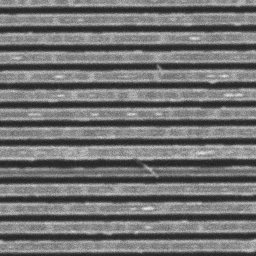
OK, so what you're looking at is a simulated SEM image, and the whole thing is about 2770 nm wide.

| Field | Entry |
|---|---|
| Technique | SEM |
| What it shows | parallel lines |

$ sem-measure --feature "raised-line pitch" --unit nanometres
204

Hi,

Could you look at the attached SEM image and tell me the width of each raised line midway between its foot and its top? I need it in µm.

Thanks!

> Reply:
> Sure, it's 0.122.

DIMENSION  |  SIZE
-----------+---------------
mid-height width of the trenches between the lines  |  0.0919 µm